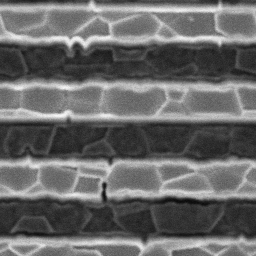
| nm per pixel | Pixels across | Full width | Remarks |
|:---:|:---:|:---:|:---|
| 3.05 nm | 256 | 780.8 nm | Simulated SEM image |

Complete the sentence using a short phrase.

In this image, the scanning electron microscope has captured one or a few lines or trenches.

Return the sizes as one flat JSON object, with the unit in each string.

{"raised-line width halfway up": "113 nm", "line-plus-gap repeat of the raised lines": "236 nanometres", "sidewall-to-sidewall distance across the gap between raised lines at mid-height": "124 nm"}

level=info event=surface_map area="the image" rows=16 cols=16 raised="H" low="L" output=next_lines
HHHHHHHHHHHHHHHH
HHHHHHHHHHHHHHHH
HHHHHHHHHHHHHHHH
LLLLLLLLLLLLLLLL
LLLLLLLLLLLLLLLL
HHHHHHHHHHHHHHHH
HHHHHHHHHHHHHHHH
LLLLLLLLLLLHHHHH
LLLLLLLLLLLLLLLL
LLLLLLLLLLLLLLLL
HHHHHHHHHHHHHHHH
HHHHHHHHHHHHHHHH
LLLLLLLLLLLLLLLL
LLLLLLLLLLLLLLLL
LLLLLLLLLLLLLLLL
HHHHHHHHHHHHHHHH